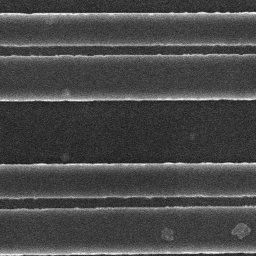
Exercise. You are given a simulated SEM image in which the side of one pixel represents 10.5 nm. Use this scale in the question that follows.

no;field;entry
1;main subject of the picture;lines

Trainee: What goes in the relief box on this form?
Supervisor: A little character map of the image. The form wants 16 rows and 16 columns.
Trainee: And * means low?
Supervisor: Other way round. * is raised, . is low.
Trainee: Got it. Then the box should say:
................
****************
****************
****************
****************
****************
................
................
................
................
****************
****************
****************
****************
****************
****************